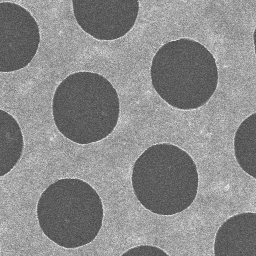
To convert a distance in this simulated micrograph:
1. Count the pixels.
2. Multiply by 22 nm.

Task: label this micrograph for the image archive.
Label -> holes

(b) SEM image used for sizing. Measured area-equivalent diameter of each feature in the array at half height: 1.52 µm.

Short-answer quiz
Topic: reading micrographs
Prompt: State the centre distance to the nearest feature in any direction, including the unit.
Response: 2250 nanometers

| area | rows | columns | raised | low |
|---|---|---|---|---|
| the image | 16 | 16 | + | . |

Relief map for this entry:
.++++....+++++++
..+++...++++++++
..+++++++++.++++
..++++++++...+++
+++++++++.....++
++++...+++...+++
+++....++++..+++
.++....++++++++.
.+++...++++++++.
.++++++++...+++.
.+++++++....+++.
+++..+++....++++
++....+++...++++
++....+++++++++.
+++...++++++++..
++++++++..+++...